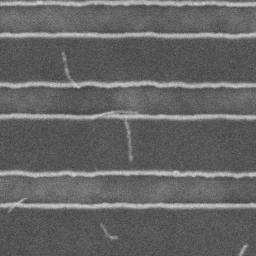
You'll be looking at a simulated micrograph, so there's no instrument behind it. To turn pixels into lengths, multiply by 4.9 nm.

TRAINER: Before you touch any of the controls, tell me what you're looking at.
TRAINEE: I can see lines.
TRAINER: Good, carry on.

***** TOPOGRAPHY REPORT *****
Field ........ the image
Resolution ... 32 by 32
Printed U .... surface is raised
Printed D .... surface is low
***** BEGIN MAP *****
UUUUUDDDUUUDDDDDDDDDUUUUUUDUUUUU
DDDDDDDDDDDDDDDDDDDDDDDDDDDDDDDD
DDDDDDDDDDDDDDDDDDDDDDDDDDDDDDDD
DDDDDDDDDDDDDDDDDDDDDDDDDDDDDDDD
UUUUUUUUUUUUUUUUUUUUUUUUUUUUUUUU
UUUUUUUUUUUUUUUUUUUUUUUUUUUUUUUU
UUUUUUUUUUUUUUUUUUUUUUUUUUUUUUUU
UUUUUUUUUUUUUUUUUUUUUUUUUUUUUUUU
UUUUUUUUUUUUUUUUUUUUUUUUUUUUUUUU
UUUUUUUUUUUUUUUUUUUUUUUUUUUUUUUU
UUUUUUUUUUUUUUUUUUUUUUUUUUUUUUUU
DDDDDDDDDDDDDDDDDDDDDDDDDDDDDDDD
DDDDDDDDDDDDDDDDDDDDDDDDDDDDDDDD
DDDDDDDDDDDDDDDDDDDDDDDDDDDDDDDD
UUUUUUUUDDDUUUUUUUUDUDDDDDUUUDDD
UUUUUUUUUUUUUUUUUUUUUUUUUUUUUUUU
UUUUUUUUUUUUUUUUUUUUUUUUUUUUUUUU
UUUUUUUUUUUUUUUUUUUUUUUUUUUUUUUU
UUUUUUUUUUUUUUUUUUUUUUUUUUUUUUUU
UUUUUUUUUUUUUUUUUUUUUUUUUUUUUUUU
UUUUUUUUUUUUUUUUUUUUUUUUUUUUUUUU
UUUUUUUUUUUUUUUUUUUUUUUUUUUUUUUU
DDDDDDDDDDDDDDDDDDDDDDDDDDDDDDDD
DDDDDDDDDDDDDDDDDDDDDDDDDDDDDDDD
DDDDDDDDDDDDDDDDDDDDDDDDDDDDDDDD
DDUDDDDDDDDDDDDDDDDDDDDDDDDDDDDD
UUUUUUUUUUUUUUUUUUUUUUUUUUUUUUUU
UUUUUUUUUUUUUUUUUUUUUUUUUUUUUUUU
UUUUUUUUUUUUUUUUUUUUUUUUUUUUUUUU
UUUUUUUUUUUUUUUUUUUUUUUUUUUUUUUU
UUUUUUUUUUUUUUUUUUUUUUUUUUUUUUUU
UUUUUUUUUUUUUUUUUUUUUUUUUUUUUUUU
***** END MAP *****